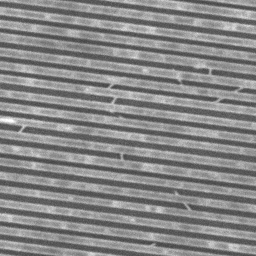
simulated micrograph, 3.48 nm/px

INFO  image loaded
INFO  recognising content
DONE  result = parallel lines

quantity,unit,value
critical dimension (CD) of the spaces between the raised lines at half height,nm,22.4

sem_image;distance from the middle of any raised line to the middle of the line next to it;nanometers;47.4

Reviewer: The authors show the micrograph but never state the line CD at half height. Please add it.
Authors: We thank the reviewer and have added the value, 25.4 nm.